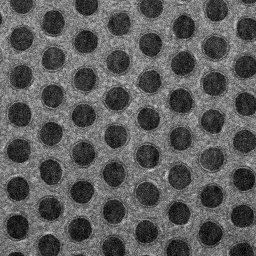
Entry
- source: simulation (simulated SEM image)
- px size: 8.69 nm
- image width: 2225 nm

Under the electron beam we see a regular array of raised bodies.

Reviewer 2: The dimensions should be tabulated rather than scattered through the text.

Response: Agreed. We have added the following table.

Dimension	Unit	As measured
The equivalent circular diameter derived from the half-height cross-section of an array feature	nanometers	217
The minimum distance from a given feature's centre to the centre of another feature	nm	317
